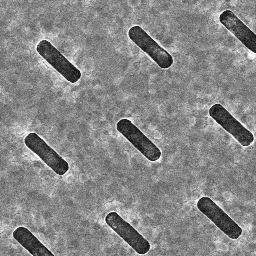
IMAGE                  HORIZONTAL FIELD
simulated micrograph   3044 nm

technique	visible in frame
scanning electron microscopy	holes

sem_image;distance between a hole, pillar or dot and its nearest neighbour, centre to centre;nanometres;1110